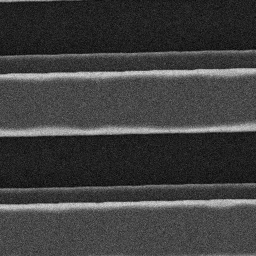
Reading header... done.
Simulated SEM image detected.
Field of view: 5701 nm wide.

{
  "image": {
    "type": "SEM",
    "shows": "lines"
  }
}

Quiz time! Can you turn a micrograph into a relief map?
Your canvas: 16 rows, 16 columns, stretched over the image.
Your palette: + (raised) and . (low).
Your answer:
................
................
................
...+++++++++++++
++++++++++++++++
++++++++++++++++
++++++++++++++++
++++++++++++++++
................
................
................
................
++++++++++++++++
++++++++++++++++
++++++++++++++++
++++++++++++++++